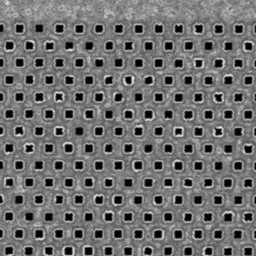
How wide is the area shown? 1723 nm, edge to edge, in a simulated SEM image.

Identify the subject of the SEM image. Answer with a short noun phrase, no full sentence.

a regular array of holes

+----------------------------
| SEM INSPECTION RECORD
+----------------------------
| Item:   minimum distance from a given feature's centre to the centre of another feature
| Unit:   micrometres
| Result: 0.132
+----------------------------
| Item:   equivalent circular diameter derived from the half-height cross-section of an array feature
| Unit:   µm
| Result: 0.0537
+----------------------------